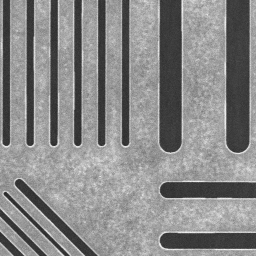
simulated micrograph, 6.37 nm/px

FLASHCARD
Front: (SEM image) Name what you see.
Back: groups of lines, slits or small figures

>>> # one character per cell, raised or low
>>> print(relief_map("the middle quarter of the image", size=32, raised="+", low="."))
++...+++...+++..++++++++......++
++...+++..++++..++++++++......++
++...+++..++++..++++++++......++
++...+++..++++..++++++++......++
++...+++..++++..++++++++......++
++...+++..++++..++++++++......++
++...+++..++++..++++++++......++
++...+++..++++..++++++++......++
++...+++..++++..++++++++......++
++...+++..++++..++++++++......++
++...+++..++++..++++++++......++
++...+++..++++..++++++++......++
++...+++..++++..++++++++......++
++...+++..++++..++++++++......++
++...+++..++++..++++++++......++
++...+++..++++..++++++++......++
++...+++..++++..++++++++......++
++...+++..++++..++++++++......++
++...+++..++++..++++++++......++
++..++++..++++..++++++++......++
+++.+++++.+++++.++++++++.....+++
+++++++++++++++++++++++++...++++
++++++++++++++++++++++++++++++++
++++++++++++++++++++++++++++++++
++++++++++++++++++++++++++++++++
++++++++++++++++++++++++++++++++
++++++++++++++++++++++++++++++++
++++++++++++++++++++++++++++++++
++++++++++++++++++++++++++++++++
++++++++++++++++++++++++++......
++++++++++++++++++++++++........
++++++++++++++++++++++++........